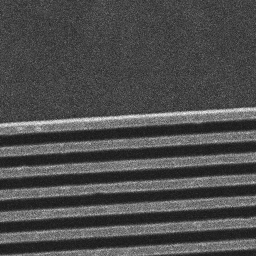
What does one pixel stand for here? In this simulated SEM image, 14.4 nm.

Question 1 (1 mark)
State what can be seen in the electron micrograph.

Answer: parallel lines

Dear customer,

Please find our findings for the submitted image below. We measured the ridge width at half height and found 160 nanometres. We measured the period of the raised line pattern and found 0.312 micrometres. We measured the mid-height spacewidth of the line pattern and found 10.2 pixels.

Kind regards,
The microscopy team